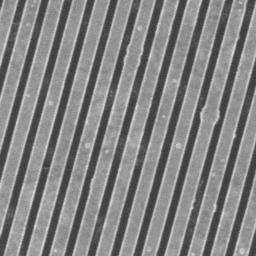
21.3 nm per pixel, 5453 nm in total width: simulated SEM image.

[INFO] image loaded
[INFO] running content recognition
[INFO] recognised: parallel lines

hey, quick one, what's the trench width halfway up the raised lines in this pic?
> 0.188 micrometres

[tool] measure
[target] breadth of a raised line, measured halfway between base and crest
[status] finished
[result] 283 nm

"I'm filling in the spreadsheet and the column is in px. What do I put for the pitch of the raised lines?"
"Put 22.2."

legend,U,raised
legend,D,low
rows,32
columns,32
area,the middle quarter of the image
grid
UDDUUUUDDUUUUDDUUUUDDUUUDDDUUUDD
UDDUUUUDDUUUDDDUUUDDDUUUDDUUUUDD
UDDUUUDDDUUUDDDUUUDDUUUUDDUUUDDD
DDDUUUDDDUUUDDUUUUDDUUUDDDUUUDDU
DDUUUUDDUUUUDDUUUDDDUUUDDUUUUDDU
DDUUUDDDUUUDDDUUUDDUUUUDDUUUUDDU
DDUUUDDDUUUDDUUUUDDUUUUDDUUUDDDU
DDUUUDDDUUUDDUUUDDDUUUDDDUUUDDUU
DUUUUDDUUUUDDUUUDDDUUUDDUUUUDDUU
DUUUDDDUUUDDDUUUDDUUUUDDUUUDDDUU
DUUUDDDUUUDDUUUUDDUUUUDDUUUDDDUU
DUUUDDUUUUDDUUUUDDUUUDDDUUUDDUUU
UUUUDDUUUUDDUUUDDDUUUDDUUUUDDUUU
UUUDDDUUUDDDUUUDDUUUUDDUUUDDDUUU
UUUDDDUUUDDUUUUDDUUUDDDUUUDDUUUU
UUUDDUUUDDDUUUDDDUUUDDUUUUDDUUUU
UUUDDUUUDDDUUUDDDUUUDDUUUUDDUUUD
UUDDDUUUDDUUUUDDUUUUDDUUUDDDUUUD
UUDDUUUUDDUUUDDDUUUDDDUUUDDUUUUD
UUDDUUUDDDUUUDDDUUUDDUUUUDDUUUUD
UDDDUUUDDUUUUDDUUUUDDUUUUDDUUUDD
UDDUUUUDDUUUUDDUUUUDDUUUDDDUUUDD
UDDUUUUDDUUUDDDUUUDDDUUUDDDUUUDD
UDDUUUDDDUUUDDDUUUDDUUUUDDUUUDDD
DDDUUUDDDUUUDDUUUUDDUUUDDDUUUDDU
DDUUUUDDUUUUDDUUUDDDUUUDDDUUUDDU
DDUUUUDDUUUDDDUUUDDDUUUDDUUUUDDU
DDUUUDDDUUUDDDUUUDDUUUUDDUUUDDDU
DDUUUDDDUUUDDUUUUDDUUUDDDUUUDDUU
DDUUUDDUUUUDDUUUDDDUUUDDDUUUDDUU
DUUUDDDUUUDDDUUUDDUUUUDDUUUUDDUU
DUUUDDDUUUDDUUUUDDUUUUDDUUUDDDUU